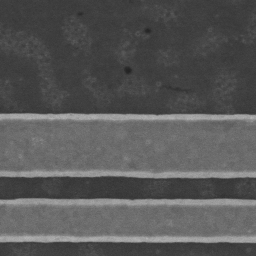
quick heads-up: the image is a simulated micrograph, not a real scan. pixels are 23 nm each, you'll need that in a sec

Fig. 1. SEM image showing one or a few lines or trenches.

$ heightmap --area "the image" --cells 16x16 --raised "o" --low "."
................
................
................
................
................
................
................
oooooooooooooooo
oooooooooooooooo
oooooooooooooooo
oooooooooooooooo
................
................
oooooooooooooooo
oooooooooooooooo
................